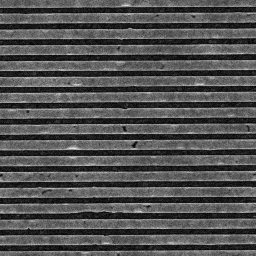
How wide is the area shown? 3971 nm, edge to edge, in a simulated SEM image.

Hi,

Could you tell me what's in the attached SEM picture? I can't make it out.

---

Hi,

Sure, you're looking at parallel lines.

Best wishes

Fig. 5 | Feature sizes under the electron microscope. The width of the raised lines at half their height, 151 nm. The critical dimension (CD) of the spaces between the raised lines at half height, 93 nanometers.